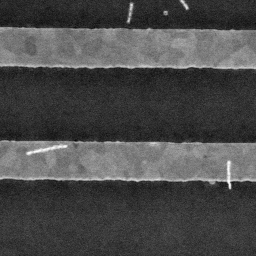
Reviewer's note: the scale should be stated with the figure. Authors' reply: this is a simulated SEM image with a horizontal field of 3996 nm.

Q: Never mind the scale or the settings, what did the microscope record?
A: lines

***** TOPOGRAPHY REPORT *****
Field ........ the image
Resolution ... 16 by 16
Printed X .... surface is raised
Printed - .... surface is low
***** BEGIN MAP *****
----------------
----------------
XXXXXXXXXXXXXXXX
XXXXXXXXXXXXXXXX
----------------
----------------
----------------
----------------
----------------
XXXXXXXXXXXXXXXX
XXXXXXXXXXXXXXXX
----------------
----------------
----------------
----------------
----------------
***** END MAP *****